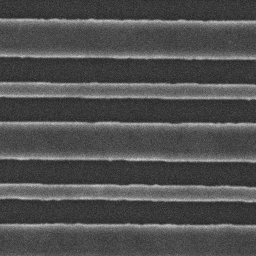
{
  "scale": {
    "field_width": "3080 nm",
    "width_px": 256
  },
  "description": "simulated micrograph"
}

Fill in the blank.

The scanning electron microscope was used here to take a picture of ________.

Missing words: lines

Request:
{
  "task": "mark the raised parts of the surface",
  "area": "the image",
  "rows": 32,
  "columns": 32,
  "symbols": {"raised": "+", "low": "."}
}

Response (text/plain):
................................
................................
+++++.+.........................
++++++++++++++++++++++++++++++++
++++++++++++++++++++++++++++++++
++++++++++++++++++++++++++++++++
++++++++++++++++++++++++++++++++
................................
................................
................................
+++++++++++++++++++++++++.......
++++++++++++++++++++++++++++++++
................................
................................
................................
+++++++++++++++++++++.+++++...+.
++++++++++++++++++++++++++++++++
++++++++++++++++++++++++++++++++
++++++++++++++++++++++++++++++++
++++++++++++++++++++++++++++++++
................................
................................
................................
++++++++++++++++++++++++++++++++
++++++++++++++++++++++++++++++++
................................
................................
................................
++++++++++++++++++++++++++++++++
++++++++++++++++++++++++++++++++
++++++++++++++++++++++++++++++++
++++++++++++++++++++++++++++++++